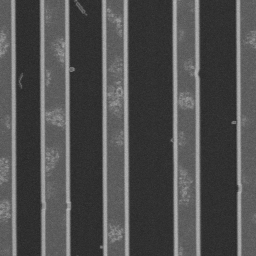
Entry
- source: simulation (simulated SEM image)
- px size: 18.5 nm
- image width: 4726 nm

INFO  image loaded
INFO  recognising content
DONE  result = one or a few lines or trenches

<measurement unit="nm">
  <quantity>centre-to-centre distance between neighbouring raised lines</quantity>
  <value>1210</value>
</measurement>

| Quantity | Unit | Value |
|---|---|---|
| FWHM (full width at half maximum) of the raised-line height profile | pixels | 22.8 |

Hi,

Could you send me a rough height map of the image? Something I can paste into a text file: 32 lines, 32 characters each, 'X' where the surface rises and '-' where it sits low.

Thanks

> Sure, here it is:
XX---XXX-----XXX------XXX-----XX
XX---XXX-----XXX------XXX-----XX
XX---XXX-----XXX------XXX-----XX
XX---XXX-----XXX------XXX-----XX
XX---XXX-----XXX------XXX-----XX
XX---XXX-----XXX------XXX-----XX
XX---XXX-----XXX------XXX-----XX
XX---XXX-----XXX------XXX-----XX
XX---XXX-----XXX------XXX-----XX
XX---XXX-----XXX------XXX-----XX
XX---XXX-----XXX------XXX-----XX
XX---XXX-----XXX------XXX-----XX
XX---XXX-----XXX------XXX-----XX
XX---XXX-----XXX------XXX-----XX
XX---XXX-----XXX------XXX-----XX
XX---XXX-----XXX------XXX-----XX
XX---XXX-----XXX------XXX-----XX
XX---XXX-----XXX------XXX-----XX
XX---XXX-----XXX------XXX-----XX
XX---XXX-----XXX------XXX-----XX
XX---XXX-----XXX------XXX-----XX
XX---XXX-----XXX------XXX-----XX
XX---XXX-----XXX------XXX-----XX
XX---XXX-----XXX------XXX-----XX
XX---XXX-----XXX------XXX-----XX
XX---XXXX----XXX------XXX-----XX
XX---XXXX----XXX------XXX-----XX
XX---XXX-----XXX------XXX-----XX
XX---XXX-----XXX------XXX-----XX
XX---XXX-----XXX------XXX-----XX
XX----XX-----XXX------XXX-----XX
XX----XX-----XXX------XXX-----XX